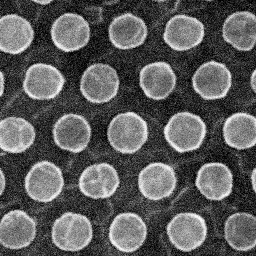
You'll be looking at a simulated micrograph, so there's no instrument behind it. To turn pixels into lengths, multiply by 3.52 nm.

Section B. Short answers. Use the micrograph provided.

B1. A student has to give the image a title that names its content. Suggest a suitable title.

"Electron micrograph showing a regular array of raised bodies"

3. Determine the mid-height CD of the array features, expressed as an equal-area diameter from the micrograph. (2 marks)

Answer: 130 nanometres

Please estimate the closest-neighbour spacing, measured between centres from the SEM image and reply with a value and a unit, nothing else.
197 nm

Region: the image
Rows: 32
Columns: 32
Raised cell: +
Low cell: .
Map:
.....+..........................
..............................+.
+++....+++....++++...+++....++++
++++...++++...++++...++++...++++
++++...++++...++++...++++...++++
++++...++++...+++....++++....+++
.+..............................
................................
....+++....+++....+++....+++....
...+++++..+++++...++++..+++++...
...+++++..+++++...++++..+++++..+
...++++...++++....+++....+++....
...........+++..................
................................
........++.....++.....++.....++.
++++...++++...++++...++++...++++
++++...++++..+++++...+++++..++++
++++...++++...++++...++++...++++
+++.....++....+++.....++......+.
................................
.....+.............+.......+....
....++++...+++....++++...++++...
+..+++++..+++++..+++++...++++...
+..+++++..+++++..+++++...++++...
....+++....+++....+++.....++....
................................
.++.............................
++++...++++...++++....+++...++++
++++...++++...++++...+++++..++++
++++...++++...++++...+++++..++++
+++....++++...++++....+++....+++
................................